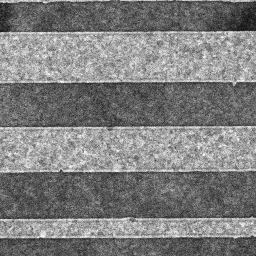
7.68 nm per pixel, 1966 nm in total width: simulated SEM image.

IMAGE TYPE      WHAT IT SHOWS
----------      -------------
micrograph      one or a few lines or trenches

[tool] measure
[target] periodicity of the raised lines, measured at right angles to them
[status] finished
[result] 656 nm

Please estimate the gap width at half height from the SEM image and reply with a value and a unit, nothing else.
352 nm